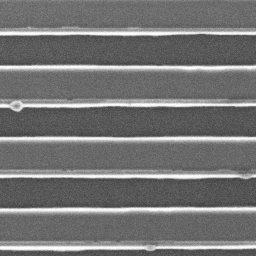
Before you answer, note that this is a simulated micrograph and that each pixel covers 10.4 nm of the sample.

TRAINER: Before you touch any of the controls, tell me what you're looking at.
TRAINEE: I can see lines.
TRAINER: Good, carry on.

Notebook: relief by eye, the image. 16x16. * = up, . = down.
****************
****************
................
................
****************
****************
****************
................
................
****************
****************
................
................
****************
****************
.........*......